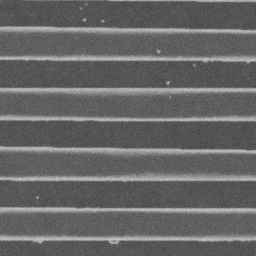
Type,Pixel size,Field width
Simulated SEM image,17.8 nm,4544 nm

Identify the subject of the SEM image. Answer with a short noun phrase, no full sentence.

lines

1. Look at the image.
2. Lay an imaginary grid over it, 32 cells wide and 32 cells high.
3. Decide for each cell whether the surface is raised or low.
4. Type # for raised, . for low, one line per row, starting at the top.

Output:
................................
................................
................................
................................
################################
################################
################################
...................#.###########
................................
................................
................................
################################
################################
################################
################################
................................
................................
................................
#...............................
################################
################################
################################
................................
................................
................................
................................
################################
################################
################################
################################
................................
................................